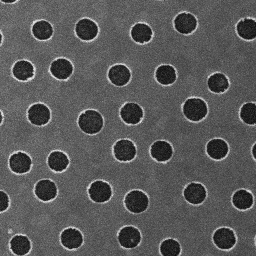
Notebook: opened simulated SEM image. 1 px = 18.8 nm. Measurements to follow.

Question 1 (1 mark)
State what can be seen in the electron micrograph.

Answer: a regular array of holes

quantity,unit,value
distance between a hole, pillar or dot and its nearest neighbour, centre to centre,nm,743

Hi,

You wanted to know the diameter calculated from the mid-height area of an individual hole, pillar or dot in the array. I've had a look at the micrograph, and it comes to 0.417 micrometres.